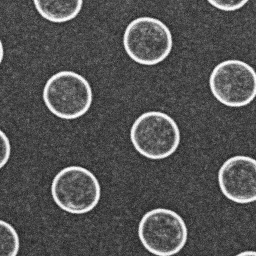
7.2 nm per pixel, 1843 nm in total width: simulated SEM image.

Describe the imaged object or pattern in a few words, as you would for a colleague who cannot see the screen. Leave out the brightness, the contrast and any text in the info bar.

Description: raised bodies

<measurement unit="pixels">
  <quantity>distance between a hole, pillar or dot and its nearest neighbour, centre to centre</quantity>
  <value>95.3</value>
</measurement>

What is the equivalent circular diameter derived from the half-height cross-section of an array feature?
319 nanometres